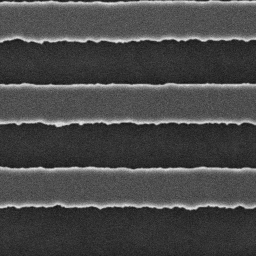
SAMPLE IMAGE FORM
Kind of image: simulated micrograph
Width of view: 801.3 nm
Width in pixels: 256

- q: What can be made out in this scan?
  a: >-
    lines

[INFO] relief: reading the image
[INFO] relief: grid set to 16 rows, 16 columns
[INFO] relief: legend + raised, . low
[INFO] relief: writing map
++++++++++++++++
++++++++++++++++
++++++++++.+++.+
................
................
++++++++++++++++
++++++++++++++++
++++++++++++++++
................
................
....++..........
++++++++++++++++
++++++++++++++++
................
................
................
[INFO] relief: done